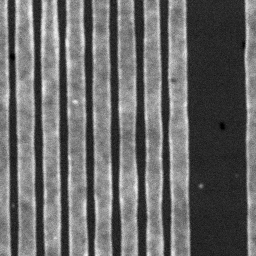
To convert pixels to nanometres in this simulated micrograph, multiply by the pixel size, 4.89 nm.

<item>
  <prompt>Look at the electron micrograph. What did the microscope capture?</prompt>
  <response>wiring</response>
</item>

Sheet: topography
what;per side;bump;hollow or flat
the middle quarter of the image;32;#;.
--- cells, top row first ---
.####..####...####..####..####..
.####..####...####..####..####..
.####..####...####..####..####..
.####..####...####..####..####..
.####..####...####..####..####..
.####..####...####..####..####..
.####..####...####..####...###..
.####..####...####...###...###..
.####..####...####...###...###..
.####..####...####...###...###..
.####..#####..####...###...###..
.####..#####..####...###...###..
.####..#####..####...###...###..
.####...####..####...###...####.
.####...####..####...###...####.
.####...###...####...###...####.
.####...###...####...###...####.
.####...###...####...###...####.
.####...###...####...###...####.
.####...###...####...###...####.
.####...###...####...###...####.
.####...####..####...###...####.
.####...####..####...###...####.
.####...####..####...###...####.
.####...####..####...###...####.
..###...####..####...###...####.
..###...####..####...###...####.
.####...####..####...###...####.
.####...####..####...###...####.
.####...####..####...###...####.
.####...####..####...###...####.
.####...####..####...###...####.